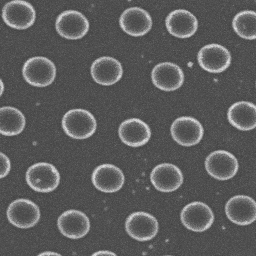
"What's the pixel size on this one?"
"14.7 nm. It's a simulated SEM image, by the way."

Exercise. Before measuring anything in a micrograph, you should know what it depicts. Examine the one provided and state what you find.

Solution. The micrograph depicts a regular array of raised bodies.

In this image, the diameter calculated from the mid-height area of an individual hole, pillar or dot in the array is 0.43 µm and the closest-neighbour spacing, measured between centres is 738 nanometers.